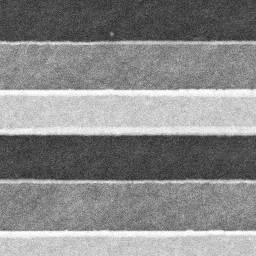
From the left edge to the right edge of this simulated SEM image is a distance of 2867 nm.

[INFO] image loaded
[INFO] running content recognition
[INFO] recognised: lines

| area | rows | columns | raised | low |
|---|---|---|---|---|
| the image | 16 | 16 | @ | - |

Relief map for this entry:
----------------
----------------
----------------
@@@@@@@@@@@@@@@@
@@@@@@@@@@@@@@@@
@@@@@@@@@@@@@@@@
@@@@@@@@@@@@@@@@
@@@@@@@@@@@@@@@@
----------------
----------------
----------------
@@@@@@@@@@@@@@@@
@@@@@@@@@@@@@@@@
@@@@@@@@@@@@@@@@
@@@@@@@@@@@@@@@@
@@@@@@@@@@@@@@@@